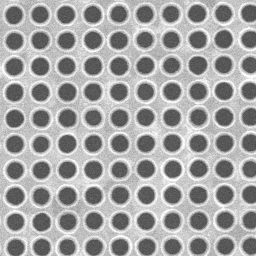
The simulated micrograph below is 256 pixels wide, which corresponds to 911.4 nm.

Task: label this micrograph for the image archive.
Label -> a regular array of holes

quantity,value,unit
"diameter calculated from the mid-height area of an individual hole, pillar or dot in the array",68.5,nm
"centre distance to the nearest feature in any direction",91.3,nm